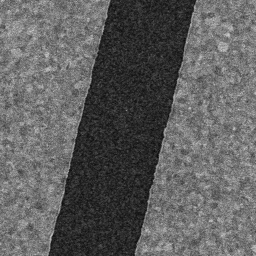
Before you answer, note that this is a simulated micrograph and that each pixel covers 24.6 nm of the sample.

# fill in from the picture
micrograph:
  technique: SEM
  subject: one or a few lines or trenches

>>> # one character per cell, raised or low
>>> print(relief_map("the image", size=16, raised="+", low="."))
+++++++.....++++
+++++++.....++++
++++++......++++
++++++.....+++++
++++++.....+++++
++++++.....+++++
+++++......+++++
+++++......+++++
+++++.....++++++
+++++.....++++++
++++......++++++
++++......++++++
++++.....+++++++
++++.....+++++++
+++......+++++++
+++......+++++++